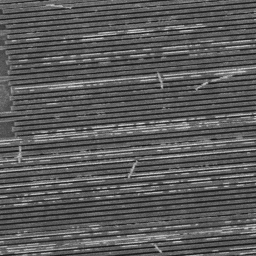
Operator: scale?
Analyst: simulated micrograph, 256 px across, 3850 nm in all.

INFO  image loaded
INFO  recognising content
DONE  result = parallel lines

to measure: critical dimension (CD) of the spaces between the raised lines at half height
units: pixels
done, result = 1.62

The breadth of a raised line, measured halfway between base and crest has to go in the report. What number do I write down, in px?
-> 3.48